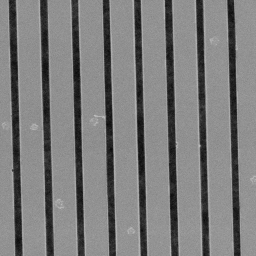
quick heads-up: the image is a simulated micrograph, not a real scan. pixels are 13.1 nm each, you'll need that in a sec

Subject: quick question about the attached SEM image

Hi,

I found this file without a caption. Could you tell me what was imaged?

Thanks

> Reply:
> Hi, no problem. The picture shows parallel lines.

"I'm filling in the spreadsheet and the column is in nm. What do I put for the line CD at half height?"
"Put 301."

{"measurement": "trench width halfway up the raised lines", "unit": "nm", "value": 99.9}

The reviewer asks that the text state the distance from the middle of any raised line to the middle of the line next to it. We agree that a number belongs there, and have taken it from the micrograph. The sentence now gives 408 nm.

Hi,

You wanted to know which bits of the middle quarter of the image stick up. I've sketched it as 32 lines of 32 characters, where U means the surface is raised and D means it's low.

UUDDUUUUUUDDUUUUUUDDUUUUUDDDUUUU
UUDDUUUUUUDDUUUUUUDDUUUUUDDDUUUU
UUDDUUUUUUDDUUUUUUDDUUUUUDDDUUUU
UUDDUUUUUUDDUUUUUUDDUUUUUUDDUUUU
UUDDUUUUUUDDUUUUUUDDUUUUUUDDUUUU
UUDDUUUUUUDDUUUUUUDDUUUUUUDDUUUU
UUDDUUUUUUDDUUUUUUDDUUUUUUDDUUUU
UUDDUUUUUUDDUUUUUUDDUUUUUUDDUUUU
UUDDUUUUUUDDUUUUUUDDUUUUUUDDUUUU
UUDDUUUUUUDDUUUUUUDDUUUUUUDDUUUU
UUDDDUUUUUDDUUUUUUDDUUUUUUDDUUUU
UUDDDUUUUUDDUUUUUUDDUUUUUUDDUUUU
UUDDDUUUUUDDUUUUUUDDUUUUUUDDUUUU
UUDDDUUUUUDDUUUUUUDDUUUUUUDDUUUU
UUDDDUUUUUDDUUUUUUDDUUUUUUDDUUUU
UUDDDUUUUUDDUUUUUUDDUUUUUUDDUUUU
UUDDDUUUUUDDDUUUUUDDUUUUUUDDUUUU
UUDDDUUUUUDDDUUUUUDDUUUUUUDDUUUU
UUDDDUUUUUDDDUUUUUDDUUUUUUDDUUUU
UUDDDUUUUUDDDUUUUUDDUUUUUUDDUUUU
UUDDDUUUUUDDDUUUUUDDUUUUUUDDUUUU
UUDDDUUUUUDDDUUUUUDDUUUUUUDDUUUU
UUDDDUUUUUDDDUUUUUDDUUUUUUDDUUUU
UUUDDUUUUUDDDUUUUUDDUUUUUUDDUUUU
UUUDDUUUUUDDDUUUUUDDUUUUUUDDUUUU
UUUDDUUUUUDDDUUUUUDDUUUUUUDDUUUU
UUUDDUUUUUDDDUUUUUDDUUUUUUDDUUUU
UUUDDUUUUUDDDUUUUUDDUUUUUUDDUUUU
UUUDDUUUUUDDDUUUUUDDDUUUUUDDUUUU
UUUDDUUUUUUDDUUUUUDDDUUUUUDDUUUU
UUUDDUUUUUUDDUUUUUDDDUUUUUDDUUUU
UUUDDUUUUUUDDUUUUUDDDUUUUUDDUUUU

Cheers